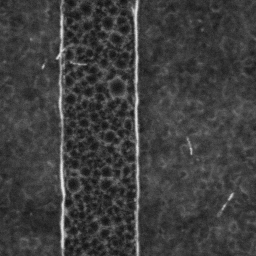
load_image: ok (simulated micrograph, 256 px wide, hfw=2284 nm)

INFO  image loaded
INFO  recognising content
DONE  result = one or a few lines or trenches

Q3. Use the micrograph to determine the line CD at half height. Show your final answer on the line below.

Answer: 0.678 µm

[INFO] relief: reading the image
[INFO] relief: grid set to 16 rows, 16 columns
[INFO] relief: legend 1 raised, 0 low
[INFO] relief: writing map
0000111110000000
0000111110000000
0000111110000000
0000111110000000
0000111110000000
0000111110000000
0000111110000000
0000111110000000
0000111110000000
0000111110000000
0000111110000000
0000111110000000
0000111110000000
0000111110000000
0000111110000000
0000111110000000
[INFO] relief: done